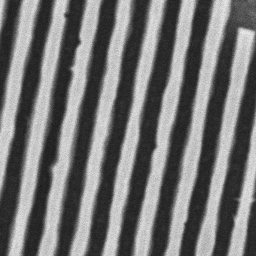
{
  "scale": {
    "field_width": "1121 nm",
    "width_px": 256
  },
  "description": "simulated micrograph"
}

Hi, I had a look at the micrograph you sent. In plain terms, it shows parallel lines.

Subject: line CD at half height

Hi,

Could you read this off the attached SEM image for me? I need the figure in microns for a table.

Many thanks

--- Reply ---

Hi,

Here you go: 0.0629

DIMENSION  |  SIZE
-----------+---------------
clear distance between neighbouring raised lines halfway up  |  17.1 px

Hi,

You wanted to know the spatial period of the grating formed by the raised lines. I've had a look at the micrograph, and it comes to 136 nm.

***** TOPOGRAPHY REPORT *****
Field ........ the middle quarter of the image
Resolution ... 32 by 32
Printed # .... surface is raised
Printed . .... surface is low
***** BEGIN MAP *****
..####.....###....####.....###..
..####.....###....####.....###..
..####....####....####.....###..
..####....####....###.....####..
..###.....####....###.....###...
.####.....####....###.....###...
.####.....###....###.....####...
.####....####....###.....####...
.####....####....###.....####...
.###.....###.....###.....####...
.###.....###.....###....####....
####....####.....##.....####....
####....####.....##.....####....
###.....####....###.....####....
###.....####....###.....###.....
###.....###.....###....####.....
###....####.....###....####....#
###....####....####....###.....#
###....####....####....###.....#
##.....###.....####....###.....#
##.....###....####.....###....##
##.....###....####.....###....##
##....####....####....####....##
##....####....####....####....##
##....###.....####....###.....##
#.....###....####.....###....###
#.....###....####.....###....###
#....####....####....####....###
#.....###....####....###.....###
.....####....###.....###.....###
.....####....###.....###....####
.....###....####....####....####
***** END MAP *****